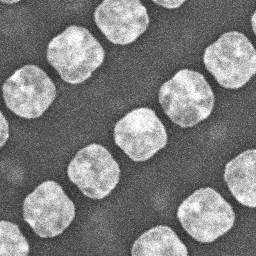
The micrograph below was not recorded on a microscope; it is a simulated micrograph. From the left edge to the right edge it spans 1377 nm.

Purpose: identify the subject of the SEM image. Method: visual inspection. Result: raised bodies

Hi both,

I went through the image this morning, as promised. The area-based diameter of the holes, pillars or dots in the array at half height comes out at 272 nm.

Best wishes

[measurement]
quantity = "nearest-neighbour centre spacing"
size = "320 nanometres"